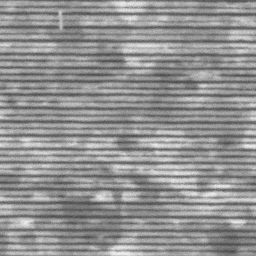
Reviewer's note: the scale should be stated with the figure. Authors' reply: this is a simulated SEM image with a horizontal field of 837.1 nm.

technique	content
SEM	parallel lines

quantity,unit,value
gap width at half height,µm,0.009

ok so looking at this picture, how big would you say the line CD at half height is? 11.9 nm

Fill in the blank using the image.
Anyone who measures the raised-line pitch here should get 22.1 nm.